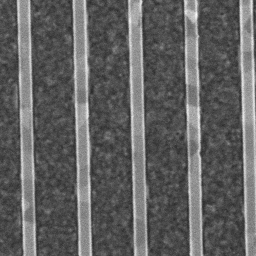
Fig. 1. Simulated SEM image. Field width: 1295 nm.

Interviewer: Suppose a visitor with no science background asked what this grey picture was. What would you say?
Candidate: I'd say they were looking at parallel lines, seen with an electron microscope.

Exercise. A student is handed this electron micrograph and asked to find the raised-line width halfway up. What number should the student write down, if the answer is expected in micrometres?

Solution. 0.0588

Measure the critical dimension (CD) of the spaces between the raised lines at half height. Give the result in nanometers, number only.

221